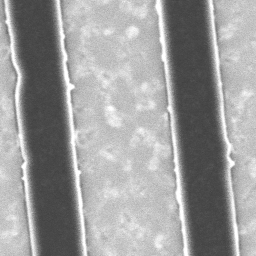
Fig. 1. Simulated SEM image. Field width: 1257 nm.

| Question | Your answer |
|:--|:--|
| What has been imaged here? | one or a few lines or trenches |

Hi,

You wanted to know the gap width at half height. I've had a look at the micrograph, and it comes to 475 nanometers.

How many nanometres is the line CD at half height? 269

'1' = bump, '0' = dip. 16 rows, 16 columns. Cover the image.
1111000000111000
1111000000111000
0111000000111000
0111000000111100
0111000000111100
0111000000111100
0111000000011100
0111100000011100
0111100000011100
0111100000011100
0111100000011100
0011100000011100
0011100000011110
0011100000011110
0011100000011110
0011100000011110